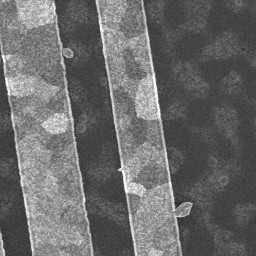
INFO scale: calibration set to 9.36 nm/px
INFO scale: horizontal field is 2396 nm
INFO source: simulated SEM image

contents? one or a few lines or trenches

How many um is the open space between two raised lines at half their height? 0.394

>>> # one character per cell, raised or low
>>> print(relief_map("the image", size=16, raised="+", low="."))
+++...+++.......
++++..+++.......
++++..+++.......
++++...++.......
++++...+++......
++++...+++......
.+++...+++......
.+++...+++......
.++++..+++......
.++++..+++......
.++++...+++.....
.++++...+++.....
..+++...+++.....
..+++...+++.....
..++++..+++.....
..++++..+++.....